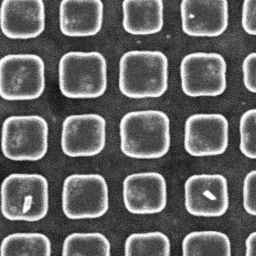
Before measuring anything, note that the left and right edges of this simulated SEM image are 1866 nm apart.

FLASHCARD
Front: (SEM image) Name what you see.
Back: a regular array of raised bodies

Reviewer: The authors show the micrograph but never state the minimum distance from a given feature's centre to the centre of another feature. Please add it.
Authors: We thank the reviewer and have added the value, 437 nm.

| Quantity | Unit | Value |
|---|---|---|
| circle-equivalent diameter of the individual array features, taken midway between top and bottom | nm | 339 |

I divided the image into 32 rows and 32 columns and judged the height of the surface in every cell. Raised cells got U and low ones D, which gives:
UUUUUDDDUUUUUDDUUUUUDDDUUUUUDDDU
UUUUUDDDUUUUUDDDUUUUDDDUUUUUDDDU
UUUUUDDDUUUUUDDDUUUUDDDUUUUUDDUU
UUUUUDDDUUUUDDDDUUUUDDDUUUUUDDDU
DUUUDDDDDDDDDDDDDDDDDDDDDDDDDDDD
DDDDDDDDDDDDDDDDDDDDDDDDDDDDDDDD
DDDDDDDDDDDDDDDDUDDDDDDDDDDDDDDD
UUUUUDDDUUUUUDDUUUUUUDDUUUUUDDDU
UUUUUDDDUUUUUDDUUUUUUDDUUUUUDDDU
UUUUUDDDUUUUUDDUUUUUUDDUUUUUDDDU
UUUUUDDDUUUUUDDUUUUUUDDUUUUUDDDU
UUUUUDDDUUUUUDDUUUUUDDDUUUUUDDDD
DDDDDDDDDDDDDDDDDDDDDDDDDDDDDDDD
DDDDDDDDDDDDDDDDDDDDDDDDDDDDDDDD
DDDDDDDDDDUUDDDDUUUUUDDDUUUDDDDU
DUUUUUDDUUUUUDDUUUUUUDDUUUUUDDUU
UUUUUUDDUUUUUDDUUUUUUDDUUUUUDDUU
UUUUUUDDUUUUUDDUUUUUUDDUUUUUDDUU
UUUUUUDDUUUUUDDUUUUUUDDUUUUUDDUU
DUUUUDDDDDDDDDDDDUUUDDDDDDDDDDDU
DDDDDDDDDDDDDDDDDDDDDDDDDDDDDDDD
DDDDDDDDDDDDDDDDDDDDDDDDDDDDDDDD
DUUUUUDDUUUUUDDDUUUUDDDDUUUUDDDU
UUUUUUDDUUUUUDDDUUUUUDDUUUUUDDDU
UUUUUUDDUUUUUDDDUUUUUDDUUUUUDDDU
UUUUUUDDUUUUUDDDUUUUDDDUUUUUDDDU
UUUUUUDDUUUUUDDDDUUDDDDDUUUUDDDU
DDDDDDDDDDDDDDDDDDDDDDDDDDDDDDDD
DDDDDDDDDDDDDDDDDDDDDDDDDDDDDDDD
DUUUUDDDDUUUUDDDDUUUDDDDUUUUDDDU
UUUUUUDDUUUUUDDDUUUUUDDUUUUUUDDU
UUUUUUDDUUUUUUDDUUUUUDDUUUUUUDDU